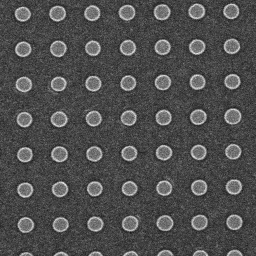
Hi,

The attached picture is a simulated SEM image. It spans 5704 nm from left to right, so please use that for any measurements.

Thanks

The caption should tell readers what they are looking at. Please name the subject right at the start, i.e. a regular array of raised bodies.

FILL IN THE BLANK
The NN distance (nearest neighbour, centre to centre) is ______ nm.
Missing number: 773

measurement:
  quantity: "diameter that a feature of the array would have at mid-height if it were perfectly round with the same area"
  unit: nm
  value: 334